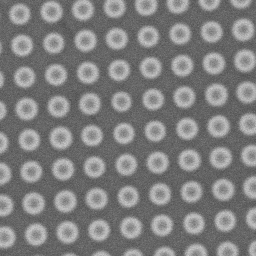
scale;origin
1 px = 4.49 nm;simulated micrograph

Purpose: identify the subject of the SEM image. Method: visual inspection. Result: an array of small figures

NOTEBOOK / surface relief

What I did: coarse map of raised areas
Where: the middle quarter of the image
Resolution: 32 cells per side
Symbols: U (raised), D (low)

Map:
DDDDUUUUDDDDUUUUDDDUUUUUDDDUUUUU
DDDUUUUUDDDUUUUUDDDUUUUUDDDUUUUU
UDDUUUUUUDDUUUUUDDDDUUUUDDDDUUUD
DDDDUUUUDDDDUUUDDDDDDDDDDDDDDDDD
DDDDDUUDDDDDDDDDDDDDDDDDDDDDDDDD
DDDDDDDDDDDDDDDDDDDDDDDDDDDDDDDD
DDDDDDDDDDDDDDDDDDDDDUUDDDDDUUUU
DDDDDDUDDDDDDUUUDDDDUUUUDDDDUUUU
DDDDUUUUUDDDUUUUUDDDUUUUUDDDUUUU
UDDDUUUUUDDDUUUUUDDDUUUUUDDDUUUU
UDDDUUUUUDDDUUUUDDDDUUUUDDDDDUUD
UDDDUUUUUDDDDUUUDDDDDDDDDDDDDDDD
DDDDDDDDDDDDDDDDDDDDDDDDDDDDDDDD
DDDDDDDDDDDDDDDDDDDDDDDDDDDDDDDD
DDDDDDDDDDDDDDDDDDDDDDUUDDDDDUUU
DDDDDDUUDDDDDUUUUDDDDUUUUDDDUUUU
UDDDDUUUUDDDDUUUUDDDUUUUUDDDUUUU
UUDDUUUUUDDDDUUUUDDDUUUUUDDDDUUU
UUDDUUUUUDDDDUUUUDDDDUUUUDDDDDUU
UUDDDUUUUDDDDDUUDDDDDDDDDDDDDDDD
UDDDDDDDDDDDDDDDDDDDDDDDDDDDDDDD
DDDDDDDDDDDDDDDDDDDDDDDDDDDDDDDU
DDDDDDDDDDDDDDDDDDDDDDUUUDDDDUUU
DDDDDDUUUDDDDDUUUDDDDUUUUUDDDUUU
UUDDDUUUUUDDDUUUUUDDDUUUUUDDDUUU
UUDDDUUUUUDDDUUUUUDDDUUUUUDDDUUU
UUDDDUUUUUDDDUUUUUDDDDUUUDDDDDDU
UUDDDDUUUDDDDDDUUDDDDDDDDDDDDDDD
UDDDDDDDDDDDDDDDDDDDDDDDDDDDDDDD
DDDDDDDDDDDDDDDDDDDDDDDDDDDDDDDD
DDDDDDDDDDDDDDDDDDDDDDUUUUDDDDUU
DDDDDDDUUUDDDDUUUUDDDDUUUUDDDUUU